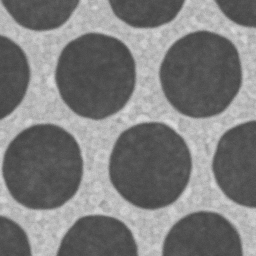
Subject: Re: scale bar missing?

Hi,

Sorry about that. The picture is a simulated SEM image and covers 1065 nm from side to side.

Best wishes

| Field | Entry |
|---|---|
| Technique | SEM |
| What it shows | holes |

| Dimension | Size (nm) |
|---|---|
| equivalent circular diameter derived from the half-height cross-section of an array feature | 351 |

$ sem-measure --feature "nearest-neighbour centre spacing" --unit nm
436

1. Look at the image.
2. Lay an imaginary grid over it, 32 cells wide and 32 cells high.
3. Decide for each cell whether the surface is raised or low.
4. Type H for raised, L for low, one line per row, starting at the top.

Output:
LLLLLLLLLLHHHHLLLLLLLLLHHHHLLLLL
HLLLLLLLLHHHHHLLLLLLLLHHHHHHLLLL
HHLLLLLLHHHHHHHLLLLLLLHHHHHHHLLL
HHHLLLLHHHHHHHHHHLLHHHHHHHHHHHHH
HHHHHHHHHHLLLLHHHHHHHHHLLLLLHHHH
LLHHHHHHLLLLLLLLHHHHHHLLLLLLLHHH
LLLHHHHHLLLLLLLLHHHHHLLLLLLLLLHH
LLLLHHHLLLLLLLLLLHHHLLLLLLLLLLHH
LLLLHHHLLLLLLLLLLHHHLLLLLLLLLLHH
LLLLHHHLLLLLLLLLLHHHLLLLLLLLLLHH
LLLLHHHLLLLLLLLLLHHHLLLLLLLLLLHH
LLLHHHHLLLLLLLLLLHHHLLLLLLLLLLHH
LLLHHHHHLLLLLLLLHHHHHLLLLLLLLHHH
LLHHHHHHHLLLLLLHHHHHHHLLLLLLHHHH
LHHHHHHHHHLLLLHHHHHHHHHLLLLHHHHH
HHHHHHHHHHHHHHHHHLLLHHHHHHHHHHLL
HHHLLLLLHHHHHHHLLLLLLLHHHHHHLLLL
HHLLLLLLLHHHHHHLLLLLLLLHHHHLLLLL
HLLLLLLLLLHHHHLLLLLLLLLLHHHLLLLL
LLLLLLLLLLHHHHLLLLLLLLLLHHHLLLLL
LLLLLLLLLLHHHHLLLLLLLLLLHHHLLLLL
LLLLLLLLLLHHHHLLLLLLLLLLHHHLLLLL
HLLLLLLLLLHHHHLLLLLLLLLLHHHLLLLL
HLLLLLLLLLHHHHLLLLLLLLLHHHHLLLLL
HLLLLLLLLHHHHHHLLLLLLLHHHHHHLLLL
HHHLLLLLHHHHHHHHLLLLLHHHHHHHHHLL
HHHHHHHHHHHHHHHHHHHHHHHHHLHHHHHH
LLHHHHHHHHLLLLLHHHHHHHLLLLLLHHHH
LLLHHHHHHLLLLLLLHHHHHLLLLLLLLHHH
LLLHHHHHLLLLLLLLLHHHHLLLLLLLLLHH
LLLLHHHHLLLLLLLLLHHHLLLLLLLLLLHH
LLLLHHHLLLLLLLLLLHHHLLLLLLLLLLHH